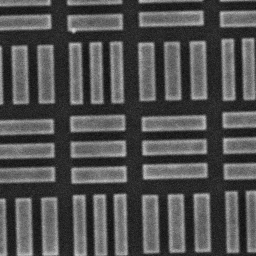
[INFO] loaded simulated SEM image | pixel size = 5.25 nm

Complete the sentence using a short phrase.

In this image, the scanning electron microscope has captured groups of lines, slits or small figures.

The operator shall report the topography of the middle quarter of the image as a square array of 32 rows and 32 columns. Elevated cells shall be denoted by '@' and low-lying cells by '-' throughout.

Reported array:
--@@---@@---@@-----@@@---@@@@---
--@@---@@---@@-----@@@---@@@@---
--@@---@@@--@@-----@@@---@@@@---
--@@---@@@--@@-----@@@---@@@@---
--@@---@@@--@@@----@@@@--@@@@---
--@@---@@@--@@@----@@@@--@@@@---
--@@---@@@--@@@----@@@@--@@@@---
--@@---@@@--@@@----@@@@--@@@@---
--@@---@@@--@@@----@@@@--@@@@---
--@@@--@@@--@@@-----------------
--------------------------------
--------------------------------
--------------------------------
--@@@@@@@@@@@@@-----@@@@@@@@@@@@
--@@@@@@@@@@@@@-----@@@@@@@@@@@@
--@@@@@@@@@@@@@-----@@@@@@@@@@@@
--@@@@@@@@@@--------@@@@@-------
--------------------------------
--------------------------------
------@@@@@@@@@-----@@@@@@@@@@@@
--@@@@@@@@@@@@@-----@@@@@@@@@@@@
--@@@@@@@@@@@@@-----@@@@@@@@@@@@
--@@@@@@@@@@@@@-----@@@---------
--------------------------------
--------------------------------
--------------------@@@@@@@@@@@@
--@@@@@@@@@@@@@-----@@@@@@@@@@@@
--@@@@@@@@@@@@@-----@@@@@@@@@@@@
--@@@@@@@@@@@@@-----@-----------
--@@@@@@@@@@--------------------
--------------------------------
--------------------------------